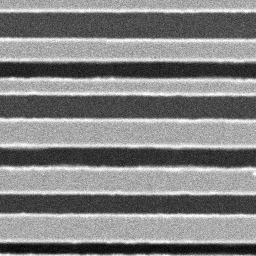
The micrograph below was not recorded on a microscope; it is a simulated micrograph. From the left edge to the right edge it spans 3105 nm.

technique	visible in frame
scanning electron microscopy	lines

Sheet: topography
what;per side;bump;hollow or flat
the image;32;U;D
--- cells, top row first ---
UUUUUUUUUUUUUUUUUUUUUUUUUUUUUUUU
DDDDDDDDDDDDDDDDDDDDDDDDDDDDDDDD
DDDDDDDDDDDDDDDDDDDDDDDDDDDDDDDD
DDDDDDDDDDDDDDDDDDDDDDDDDDDDDDDD
DDDDDDDDDDDDDDDDDDDDDDDDDDDDDDDD
UUUUUUUUUUUUUUUUUUUUUUUUUUUUUUUU
UUUUUUUUUUUUUUUUUUUUUUUUUUUUUUUU
UUUUUUUUUUUUUUUUUUUUUUUUUUUUUUUU
DDDDDDDDDDDDDDDDDDDDDDDDDDDDDDDD
DDDDDDDDDDDDDDDDDDDDDDDDDDDDDDDD
UUUUUUUUUUUUUUUUUUUUUUUUUUUUUUUU
UUUUUUUUUUUUUUUUUUUUUUUUUUUUUUUU
DDDDDDDDDDDDDDDDDDDDDDDDDDDDDDDD
DDDDDDDDDDDDDDDDDDDDDDDDDDDDDDDD
DDDDDDDDDDDDDDDDDDDDDDDDDDDDDDDD
UUUUUUUUUUUUUUUUUUUUUUUUUUUUUUUU
UUUUUUUUUUUUUUUUUUUUUUUUUUUUUUUU
UUUUUUUUUUUUUUUUUUUUUUUUUUUUUUUU
DDDDDDDDDDDDDDDDDDDDDDDDDDDDDDDD
DDDDDDDDDDDDDDDDDDDDDDDDDDDDDDDD
DDDDDDDDDDDDDDDDDDDDDDDDDDDDDDDD
UUUUUUUUUUUUUUUUUUUUUUUUUUUUUUUU
UUUUUUUUUUUUUUUUUUUUUUUUUUUUUUUU
UUUUUUUUUUUUUUUUUUUUUUUUUUUUUUUU
DDDDDDDDDDDDDDDDDDDDDDDDDDDDDDDD
DDDDDDDDDDDDDDDDDDDDDDDDDDDDDDDD
DDDDDDDDDDDDDDDDDDDDDDDDDDDDDDDD
UUUUUUUUUUUUUUUUUUUUUUUUUUUUUUUU
UUUUUUUUUUUUUUUUUUUUUUUUUUUUUUUU
UUUUUUUUUUUUUUUUUUUUUUUUUUUUUUUU
DDDDDDDDDDDDDDDDDDDDDDDDDDDDDDDD
DDDDDDDDDDDDDDDDDDDDDDDDDDDDDDDD